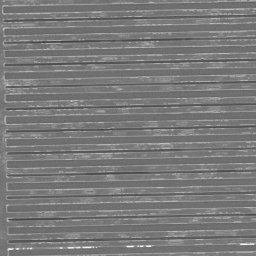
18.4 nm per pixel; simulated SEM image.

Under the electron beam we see parallel lines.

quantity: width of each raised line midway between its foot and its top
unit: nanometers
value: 111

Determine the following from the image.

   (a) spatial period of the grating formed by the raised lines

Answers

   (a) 0.201 µm